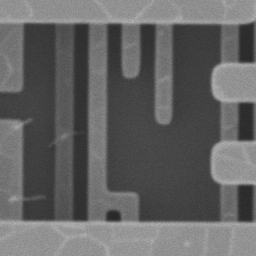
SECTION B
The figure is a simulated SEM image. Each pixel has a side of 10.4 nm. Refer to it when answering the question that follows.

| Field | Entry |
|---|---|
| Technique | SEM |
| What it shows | wiring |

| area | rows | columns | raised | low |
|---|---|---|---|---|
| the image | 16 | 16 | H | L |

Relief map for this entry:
HHHHHHHHHHHHHHHH
LLLLLLLLLLLLLLLL
LLLLLLLLLLLLLLLL
LLLLLLLLLLLLLLLL
LLLLLLLLLLLLLHHH
LLLLLLLLLLLLLHHH
LLLLLLLLLLLLLLLL
LLLLLLLLLLLLLLLL
LLLLLLLLLLLLLLLL
LLLLLLLLLLLLLHHH
LLLLLLLLLLLLLHHH
LLLLLLLLLLLLLLLL
LLLLLLLLLLLLLLLL
LLLLLLLLLLLLLLLL
HHHHHHHHHHHHHHHH
HHHHHHHHHHHHHHHH